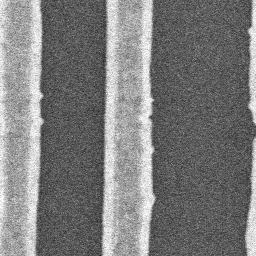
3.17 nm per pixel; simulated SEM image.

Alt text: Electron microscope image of one or a few lines or trenches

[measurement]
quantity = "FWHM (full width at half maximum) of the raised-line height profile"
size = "110 nm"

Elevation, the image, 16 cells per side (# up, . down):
##.....##.......
##.....##.......
##.....##.......
##.....##.......
##.....##.......
##.....##.......
##.....##.......
##.....##.......
##.....##.......
##.....##.......
##.....##.......
##.....##.......
##.....##.......
##.....##.......
##.....##.......
##.....##.......